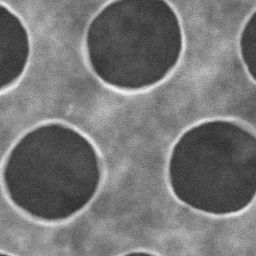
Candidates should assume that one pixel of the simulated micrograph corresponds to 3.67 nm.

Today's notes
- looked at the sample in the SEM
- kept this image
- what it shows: holes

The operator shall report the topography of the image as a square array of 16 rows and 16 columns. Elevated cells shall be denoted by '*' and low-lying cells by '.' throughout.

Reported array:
*******....*****
.*****.....****.
..***......****.
..****.....****.
.*****.....*****
*******..*******
****************
****************
**...******.....
*.....*****.....
......*****.....
......*****.....
*.....*****.....
**..************
****************
****************